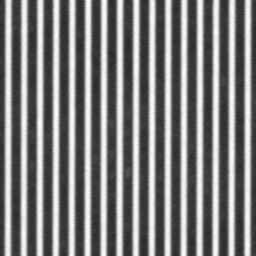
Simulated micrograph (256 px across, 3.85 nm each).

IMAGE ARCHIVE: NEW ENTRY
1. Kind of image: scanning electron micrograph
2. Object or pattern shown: parallel lines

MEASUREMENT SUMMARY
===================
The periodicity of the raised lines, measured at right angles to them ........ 61.5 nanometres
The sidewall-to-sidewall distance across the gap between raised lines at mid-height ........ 38.5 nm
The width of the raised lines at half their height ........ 24.5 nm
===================